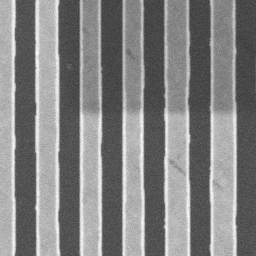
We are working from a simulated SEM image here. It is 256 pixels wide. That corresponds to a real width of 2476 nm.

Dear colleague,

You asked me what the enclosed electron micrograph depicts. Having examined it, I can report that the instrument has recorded lines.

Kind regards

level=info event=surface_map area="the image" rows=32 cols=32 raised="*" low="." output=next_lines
**...**...***...**...***..***...
**...**...***..***...***..***...
**...**...***..***...***..***...
**...**...***..***...***..***...
**...**...***..***...***..***...
**...**...***..***...***..***...
**...**...***..***...***..***...
**...**...***..***...***..***...
**...**...***..***...***..***...
**...**...***..***...***..***...
**...**...***..***...***..***...
**...**...***..***...**...***...
**...**...***...**...**...***...
**...**...***...**...**...***...
**...**...***...**...***..***...
**...**...***..***...***..***...
**...**...***..***...***..***...
**...**...***...**...***..***...
**...**...***...**...***..***...
**...**...***...**...***..***...
**...**...***...**...***..***...
**...**...***...**...**...***...
**...**...***...**...***..***...
**...**...***...**...***..***...
**...**...***...**...***..***...
**...**...***..***...***..***...
**...**...***..***...***..***...
**...**...***..***...***..***...
**...**...***..***...***..***...
**...**...***..***...***..***...
**...**...***..***...***..***...
**...**...***..***...***..***...